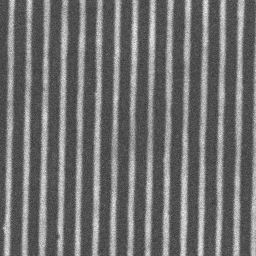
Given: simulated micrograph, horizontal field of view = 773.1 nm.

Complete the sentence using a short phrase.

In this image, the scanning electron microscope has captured parallel lines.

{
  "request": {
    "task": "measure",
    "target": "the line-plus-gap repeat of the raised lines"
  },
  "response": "0.0531 microns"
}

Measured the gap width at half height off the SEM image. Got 35.4 nm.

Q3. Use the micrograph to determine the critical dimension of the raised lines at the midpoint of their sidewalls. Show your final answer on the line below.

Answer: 18.8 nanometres